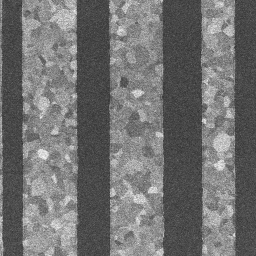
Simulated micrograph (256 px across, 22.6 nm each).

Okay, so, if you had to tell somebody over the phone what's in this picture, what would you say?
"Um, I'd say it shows one or a few lines or trenches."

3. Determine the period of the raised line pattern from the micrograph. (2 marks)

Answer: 1900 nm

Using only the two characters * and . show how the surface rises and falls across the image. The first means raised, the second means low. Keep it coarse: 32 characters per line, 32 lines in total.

...*******....******.....****...
.********.....******.....****...
.********.....******.....****...
...*******....******.....****...
...******.....******.....****...
...*******....******.....****...
...*******....******.....****...
...*******....******.....****...
...*******....******.....****...
...*******....******.....****...
...*******....******.....****...
...*******....******.....****...
...*******....******.....****...
...*******....*******....****...
...*******....*******....****...
...*******...*******.....****...
...*******....******.....****...
...*******....******.....****...
...*******....******.....****.*.
...*******....******.....****.**
...*******....******.....****..*
...*******....******.....****...
...*******....******.....****...
...*******....******.....****...
...*******....******.....****...
...*******....******.....****...
...*******....******.....****...
...*******....******.....****...
...*******....******.....****...
...*******....******.....****...
...*******....******.....****...
...*******....******.....****...